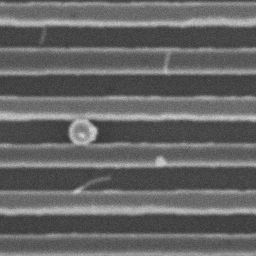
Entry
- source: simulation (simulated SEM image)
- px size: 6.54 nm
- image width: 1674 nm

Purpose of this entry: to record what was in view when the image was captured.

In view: lines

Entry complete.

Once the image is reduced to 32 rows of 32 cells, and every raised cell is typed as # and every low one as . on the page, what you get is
################################
################################
################################
................................
................................
................................
################################
################################
################################
................................
................................
................................
################################
################################
################################
.........##.....................
.........###....................
.........###....................
################################
################################
################################
................................
................................
................................
################################
################################
###########.######...###########
................................
................................
################################
################################
################################